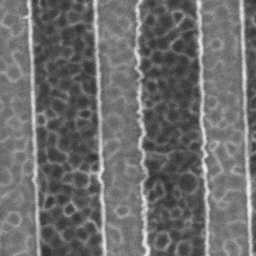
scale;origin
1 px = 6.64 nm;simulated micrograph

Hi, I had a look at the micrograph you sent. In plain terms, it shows one or a few lines or trenches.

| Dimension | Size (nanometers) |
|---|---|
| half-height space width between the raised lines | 278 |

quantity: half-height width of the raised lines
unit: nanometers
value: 435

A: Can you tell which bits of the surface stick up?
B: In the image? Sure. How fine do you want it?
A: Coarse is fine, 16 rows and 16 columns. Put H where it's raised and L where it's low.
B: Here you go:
LLHHHHLLLHHHLLLH
LLHHHHLLLHHHHLLH
LLHHHHLLLHHHHLLH
LLHHHHLLLHHHHLLH
LLHHHHLLLHHHHLLH
LLHHHHLLLHHHHLLH
LLHHHHLLLHHHHLLH
LLHHHHLLLHHHHLLH
LLHHHHLLLHHHHLLH
LLHHHHLLLHHHHLLH
LLHHHHLLLHHHHLLH
LLHHHHLLLHHHHLLL
LLHHHHLLLHHHHLLL
LLHHHHHLLHHHHLLL
LLHHHHHLLHHHHLLL
LLHHHHHLLHHHHLLL